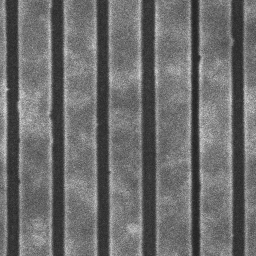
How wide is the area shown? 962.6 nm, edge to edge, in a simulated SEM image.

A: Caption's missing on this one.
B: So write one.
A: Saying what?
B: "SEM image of parallel lines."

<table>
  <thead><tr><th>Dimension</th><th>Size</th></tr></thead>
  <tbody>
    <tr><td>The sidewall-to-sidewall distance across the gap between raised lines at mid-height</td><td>44.2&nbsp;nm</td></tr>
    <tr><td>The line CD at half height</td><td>125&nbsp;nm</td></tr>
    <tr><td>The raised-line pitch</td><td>169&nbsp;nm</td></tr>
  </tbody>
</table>